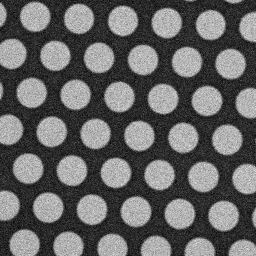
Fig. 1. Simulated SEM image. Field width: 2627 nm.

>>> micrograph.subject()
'an array of small figures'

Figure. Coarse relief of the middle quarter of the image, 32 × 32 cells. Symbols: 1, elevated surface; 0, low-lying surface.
00000011111100001111111000011111
00000001111000000111110000001111
00000000000000000001100000000111
00000000000000000000000000000000
01111000000000000000000000000000
11111100000111110000000111000000
11111100000111111000001111110000
11111100001111111000011111110000
11111100001111111000011111110000
11111100001111111000011111110000
01111000000111111000001111110000
00000000000011110000001111100000
00000000000000000000000000000000
00000000000000000000000000000000
00000011110000000011000000000000
00000111111000001111100000001111
10001111111000011111110000011111
10001111111000011111110000111111
00001111111000011111110000111111
00000111111000001111110000111111
00000011110000001111100000011111
00000000000000000011000000001111
00000000000000000000000000000000
11110000000000000000000000000000
11111000001111100000001111000000
11111000001111110000011111100000
11111100011111111000111111100000
11111100011111111000111111100001
11111000011111110000111111100001
11110000001111110000011111100001
00000000000111100000011111000000
00000000000000000000000000000000